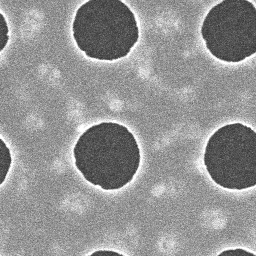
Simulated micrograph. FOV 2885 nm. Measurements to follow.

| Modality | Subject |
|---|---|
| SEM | holes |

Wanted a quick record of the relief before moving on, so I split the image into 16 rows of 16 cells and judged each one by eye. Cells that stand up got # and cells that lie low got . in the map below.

#####...#####...
#####....####...
#####....####...
######..#####...
################
################
################
################
#####...#####...
.####....####...
.####....####...
######..######..
################
################
################
################